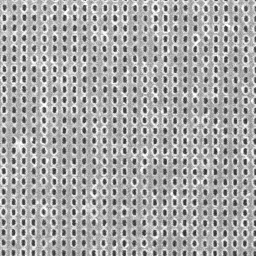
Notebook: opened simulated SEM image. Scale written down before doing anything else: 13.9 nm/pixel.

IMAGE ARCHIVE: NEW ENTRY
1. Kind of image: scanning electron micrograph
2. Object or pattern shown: a regular array of holes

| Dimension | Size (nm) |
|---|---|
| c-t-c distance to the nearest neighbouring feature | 138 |